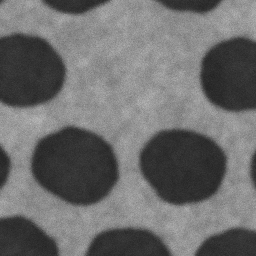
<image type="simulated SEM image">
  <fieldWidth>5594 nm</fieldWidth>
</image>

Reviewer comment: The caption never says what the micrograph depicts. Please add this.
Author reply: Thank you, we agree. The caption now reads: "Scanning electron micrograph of holes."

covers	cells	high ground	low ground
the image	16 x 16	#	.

###...####...###
################
...###########..
....#########...
....#########...
....#########...
...##########...
################
###...####...###
##.....##.....##
.#.....##.....##
##.....##.....##
####..####...###
################
...###...#####..
....##.....#....